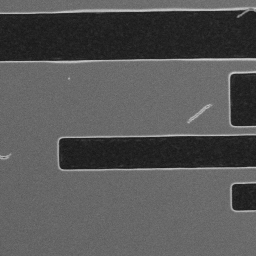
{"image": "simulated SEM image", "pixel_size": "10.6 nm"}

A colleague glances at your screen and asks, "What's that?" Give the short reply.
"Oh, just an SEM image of groups of lines, slits or small figures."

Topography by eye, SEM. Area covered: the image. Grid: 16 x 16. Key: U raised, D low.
UUUUUUUUUUUUUUUU
DDDDDDDDDDDDDDDD
DDDDDDDDDDDDDDDD
DDDDDDDDDDDDDDDD
UUUUUUUUUUUUUUUU
UUUUUUUUUUUUUUDD
UUUUUUUUUUUUUUDD
UUUUUUUUUUUUUUDD
UUUUUUUUUUUDDDDD
UUUUDDDDDDDDDDDD
UUUUDDDDDDDDDDDU
UUUUUUUUUUUUUUUD
UUUUUUUUUUUUUUDD
UUUUUUUUUUUUUUUU
UUUUUUUUUUUUUUUU
UUUUUUUUUUUUUUUU